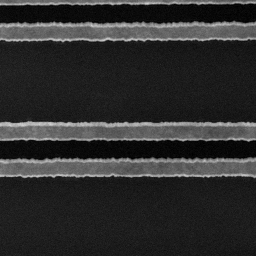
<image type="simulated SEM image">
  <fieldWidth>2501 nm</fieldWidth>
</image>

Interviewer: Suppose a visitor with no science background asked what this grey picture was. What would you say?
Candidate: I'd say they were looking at lines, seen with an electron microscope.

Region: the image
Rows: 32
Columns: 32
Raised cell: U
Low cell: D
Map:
UUUUUUUUUUUUDUUDUUUDDDDDDDDDDDDD
DDDDDDDDDDDDDDDDDDDDDDDDDDDDDDDD
DDDDDDDDDDDDDDDDDDDDDDDDDDDDDDDD
UUUUUUUUUUUUUUUUUUUUUUUUUUUUUUUU
UUUUUUUUUUUUUUUUUUUUUUUUUUUUUUUU
DDDDDDDDDDDDDDDDDDDDDDDDDDDDDDDD
DDDDDDDDDDDDDDDDDDDDDDDDDDDDDDDD
DDDDDDDDDDDDDDDDDDDDDDDDDDDDDDDD
DDDDDDDDDDDDDDDDDDDDDDDDDDDDDDDD
DDDDDDDDDDDDDDDDDDDDDDDDDDDDDDDD
DDDDDDDDDDDDDDDDDDDDDDDDDDDDDDDD
DDDDDDDDDDDDDDDDDDDDDDDDDDDDDDDD
DDDDDDDDDDDDDDDDDDDDDDDDDDDDDDDD
DDDDDDDDDDDDDDDDDDDDDDDDDDDDDDDD
DDDDDDDDDDDDDDDDDDDDDDDDDDDDDDDD
UUUUUUUUUUUUUUUUUUUUUUUUUUUUUUUU
UUUUUUUUUUUUUUUUUUUUUUUUUUUUUUUU
UUUUUUUUUUUUUUUUUUUUUUUUUUUUUUUU
DDDDDDDDDDDDDDDDDDDDDDDDDDDDDDDD
DDDDDDDDDDDDDDDDDDDDDDDDDDDDDDDD
UUUUUUUUUUUUUUUUUUUUUUUUUUUUUUUU
UUUUUUUUUUUUUUUUUUUUUUUUUUUUUUUU
DDDDDDDDDDDDDDDDDDDDDDDDDDDDDDDD
DDDDDDDDDDDDDDDDDDDDDDDDDDDDDDDD
DDDDDDDDDDDDDDDDDDDDDDDDDDDDDDDD
DDDDDDDDDDDDDDDDDDDDDDDDDDDDDDDD
DDDDDDDDDDDDDDDDDDDDDDDDDDDDDDDD
DDDDDDDDDDDDDDDDDDDDDDDDDDDDDDDD
DDDDDDDDDDDDDDDDDDDDDDDDDDDDDDDD
DDDDDDDDDDDDDDDDDDDDDDDDDDDDDDDD
DDDDDDDDDDDDDDDDDDDDDDDDDDDDDDDD
DDDDDDDDDDDDDDDDDDDDDDDDDDDDDDDD